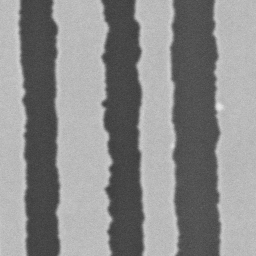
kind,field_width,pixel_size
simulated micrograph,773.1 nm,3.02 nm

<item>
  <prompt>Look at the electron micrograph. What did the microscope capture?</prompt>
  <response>lines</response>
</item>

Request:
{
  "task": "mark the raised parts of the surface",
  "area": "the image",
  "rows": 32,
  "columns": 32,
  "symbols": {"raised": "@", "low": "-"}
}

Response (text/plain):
@@@----@@@@@@----@@@@@-----@@@@@
@@-----@@@@@@----@@@@@-----@@@@@
@@-----@@@@@@----@@@@@-----@@@@@
@@-----@@@@@@----@@@@------@@@@@
@@-----@@@@@@----@@@@@-----@@@@@
@@@----@@@@@@----@@@@------@@@@@
@@@----@@@@@@-----@@@------@@@@@
@@@----@@@@@@----@@@@------@@@@@
@@@----@@@@@@----@@@@------@@@@@
@@@----@@@@@@----@@@@------@@@@@
@@@----@@@@@@----@@@@@-----@@@@@
@@@----@@@@@@-----@@@@-----@@@@@
@@@----@@@@@@-----@@@@-----@@@@@
@@@----@@@@@@-----@@@@-----@@@@@
@@@----@@@@@@----@@@@@-----@@@@@
@@@----@@@@@@----@@@@@-----@@@@@
@@@----@@@@@@----@@@@@------@@@@
@@@----@@@@@@----@@@@@-----@@@@@
@@@----@@@@@@----@@@@@-----@@@@@
@@@----@@@@@@@----@@@@-----@@@@@
@@@----@@@@@@@----@@@@-----@@@@@
@@@----@@@@@@@----@@@@-----@@@@@
@@@----@@@@@@@----@@@@-----@@@@@
@@@----@@@@@@-----@@@@-----@@@@@
@@@----@@@@@@-----@@@@-----@@@@@
@@@----@@@@@@@----@@@@-----@@@@@
@@@----@@@@@@-----@@@@-----@@@@@
@@@----@@@@@@@----@@@@-----@@@@@
@@@----@@@@@@-----@@@@------@@@@
@@@----@@@@@@-----@@@@-----@@@@@
@@@-----@@@@@-----@@@@------@@@@
@@@----@@@@@@@----@@@@-----@@@@@